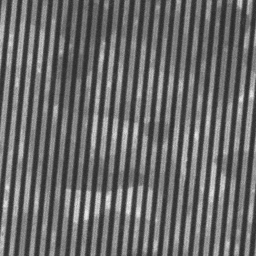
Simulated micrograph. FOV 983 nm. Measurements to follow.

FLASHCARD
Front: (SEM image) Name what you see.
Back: parallel lines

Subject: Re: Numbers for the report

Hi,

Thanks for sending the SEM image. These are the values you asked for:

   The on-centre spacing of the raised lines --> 0.0392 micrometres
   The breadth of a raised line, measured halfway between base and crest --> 15.3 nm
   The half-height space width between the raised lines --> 22.5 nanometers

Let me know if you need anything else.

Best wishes